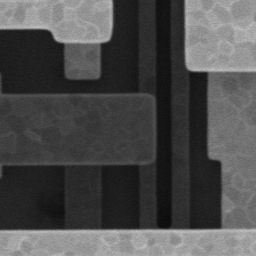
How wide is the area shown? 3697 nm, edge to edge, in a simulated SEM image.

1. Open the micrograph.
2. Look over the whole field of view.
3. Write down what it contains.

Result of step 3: wiring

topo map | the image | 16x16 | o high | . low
ooooooo.....oooo
ooooooo.....oooo
....ooo.....oooo
............oooo
................
................
oooooooooo......
oooooooooo......
oooooooooo......
oooooooooo......
................
................
................
................
oooooooooooooooo
oooooooooooooooo